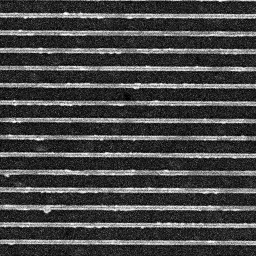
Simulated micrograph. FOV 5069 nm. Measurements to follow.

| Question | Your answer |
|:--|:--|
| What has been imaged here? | parallel lines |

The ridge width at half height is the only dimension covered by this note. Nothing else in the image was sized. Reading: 74.3 nanometers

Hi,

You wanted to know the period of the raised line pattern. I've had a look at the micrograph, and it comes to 345 nm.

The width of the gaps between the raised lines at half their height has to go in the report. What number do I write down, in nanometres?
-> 267